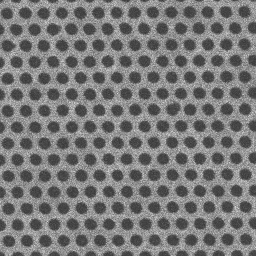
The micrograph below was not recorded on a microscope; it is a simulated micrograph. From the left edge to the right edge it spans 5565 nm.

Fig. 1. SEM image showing a regular array of holes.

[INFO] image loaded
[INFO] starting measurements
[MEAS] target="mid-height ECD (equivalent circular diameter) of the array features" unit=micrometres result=0.275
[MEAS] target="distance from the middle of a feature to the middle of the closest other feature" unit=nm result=394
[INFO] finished